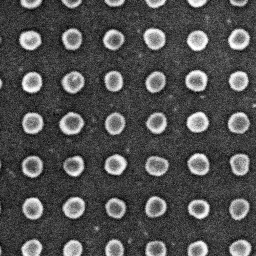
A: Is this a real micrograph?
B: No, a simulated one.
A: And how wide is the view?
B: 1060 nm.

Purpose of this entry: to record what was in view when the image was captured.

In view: a regular array of raised bodies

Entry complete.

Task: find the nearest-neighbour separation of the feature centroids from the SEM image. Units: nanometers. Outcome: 169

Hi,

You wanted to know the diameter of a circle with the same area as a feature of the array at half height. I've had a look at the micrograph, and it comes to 81.1 nanometres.